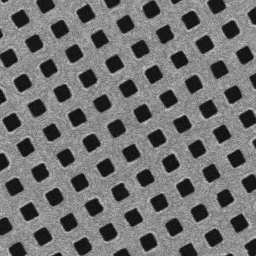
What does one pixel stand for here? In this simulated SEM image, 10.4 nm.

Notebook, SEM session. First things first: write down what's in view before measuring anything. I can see a regular array of holes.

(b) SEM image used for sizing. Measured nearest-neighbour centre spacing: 0.297 um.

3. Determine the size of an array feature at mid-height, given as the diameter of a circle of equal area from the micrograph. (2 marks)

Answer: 174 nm